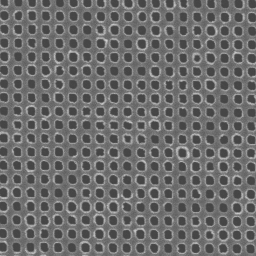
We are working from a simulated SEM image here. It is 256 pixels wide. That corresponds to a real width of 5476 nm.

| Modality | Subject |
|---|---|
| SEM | a regular array of holes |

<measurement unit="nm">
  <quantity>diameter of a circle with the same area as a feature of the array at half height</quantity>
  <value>192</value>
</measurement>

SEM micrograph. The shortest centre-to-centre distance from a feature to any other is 285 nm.